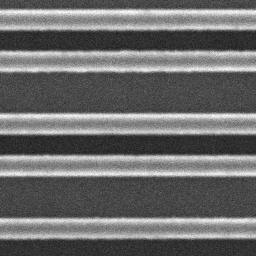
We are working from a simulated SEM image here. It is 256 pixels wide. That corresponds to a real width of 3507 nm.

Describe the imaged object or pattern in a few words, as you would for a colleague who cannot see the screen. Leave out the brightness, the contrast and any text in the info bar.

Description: lines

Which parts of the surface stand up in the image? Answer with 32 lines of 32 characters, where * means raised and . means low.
................................
********************************
********************************
********************************
................................
................................
...............*................
********************************
********************************
................................
................................
................................
................................
................................
********************************
********************************
********************************
................................
................................
..********.*.**********.***.**..
********************************
********************************
................................
................................
................................
................................
................................
********************************
********************************
********************************
................................
................................